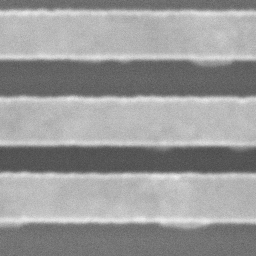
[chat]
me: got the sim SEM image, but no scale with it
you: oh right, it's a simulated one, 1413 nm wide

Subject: lines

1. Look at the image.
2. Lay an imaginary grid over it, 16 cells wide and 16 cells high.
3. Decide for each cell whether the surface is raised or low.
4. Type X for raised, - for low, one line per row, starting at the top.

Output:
----------------
XXXXXXXXXXXXXXXX
XXXXXXXXXXXXXXXX
XXXXXXXXXXXXXXXX
----------------
----------------
XXXXXXXXXXXXXXXX
XXXXXXXXXXXXXXXX
XXXXXXXXXXXXXXXX
----------------
----------------
XXXXXXXXXXXXXXXX
XXXXXXXXXXXXXXXX
XXXXXXXXXXXXXXXX
----------------
----------------